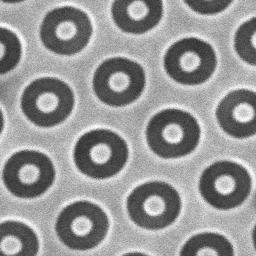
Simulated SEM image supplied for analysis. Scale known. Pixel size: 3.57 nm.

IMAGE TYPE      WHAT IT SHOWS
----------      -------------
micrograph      a regular array of ring-shaped grooves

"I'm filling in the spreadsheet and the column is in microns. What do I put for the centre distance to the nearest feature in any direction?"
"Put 0.263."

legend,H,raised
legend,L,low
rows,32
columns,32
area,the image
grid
HHHHHHHHHHHHHHLLHHLLHHHLLLLLLHHH
HHHHHHLLLLLHHHLLHHLLHHHHLLLLHHHH
HHHHHLLLLLLHHHLLLLLLHHHHHHHHHHHL
LHHHHLLHHLLLHHHLLLLHHHHHHHHHHHLL
LLHHHLLHHLLHHHHHHHHHHHHHHHHHHLLL
LLLHHLLLLLLHHHHHHHHHHLLLLLHHHLLL
LLLHHHLLLLHHHHHHHHHHHLLLLLLHHLLL
LLHHHHHHHHHHHLLLLHHHLLLHHLLHHHLL
LLHHHHHHHHHHLLLLLLHHHLLHLLLHHHHH
HHHHHHHHHHHHLLHHLLHHHLLLLLHHHHHH
HHHHLLLLHHHHLLHHLLHHHHHLLHHHHHHH
HHHLLLLLLHHHLLLLLLHHHHHHHHHHHLLL
HHHLLHHLLHHHLLLLLHHHHHHHHHHHLLLL
HHHLLHHLLHHHHHHHHHHHHHHHHHHLLHHL
HHHLLLLLLHHHHHHHHHHLLLLLHHHLLHHH
HHHHLLLHHHHHHHHHHHLLLLLLLHHLLLLL
HHHHHHHHHHHLLLHHHHLLHHHLLHHHLLLL
HHHHHHHHHHLLLLLLHHLLLHLLLHHHHHHH
HHHHHHHHHLLLHHLLHHHLLLLLHHHHHHHH
HLLLLLHHHLLHHHLLHHHHLLLHHHHHHHHH
HLLLLLLHHLLLLLLLHHHHHHHHHHLLLLHH
LLHHHLLHHHLLLLLHHHHHHHHHHLLLLLLH
LLLHLLLHHHHHHHHHHHHHHHHHHLLHHLLH
HLLLLLHHHHHHHHHHHLLLLLHHHLLHHLLH
HHLLLHHHHHHHHHHHLLLLLLHHHLLLLLLH
HHHHHHHHHLLLHHHHLLHHHLLHHHLLLLHH
HHHHHHHHLLLLLHHHLLHHLLHHHHHHHHHH
HHHHHHHLLHHLLLHHLLLLLLHHHHHHHHHH
LLLLHHHLLHHLLLHHHHLLLHHHHHHHHHHH
LLLLLHHLLLLLLHHHHHHHHHHHLLLLHHHL
HHHLLHHHLLLLHHHHHHHHHHHLLLLLLHHH
LHLLLHHHHHHHHHHHLLHHHHHLLHHLLHHH